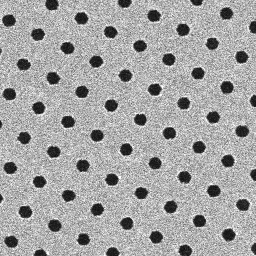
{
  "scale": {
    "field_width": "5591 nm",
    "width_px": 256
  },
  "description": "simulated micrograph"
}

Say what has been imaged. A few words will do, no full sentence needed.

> a regular array of holes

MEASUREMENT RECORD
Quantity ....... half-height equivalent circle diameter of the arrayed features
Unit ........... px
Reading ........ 13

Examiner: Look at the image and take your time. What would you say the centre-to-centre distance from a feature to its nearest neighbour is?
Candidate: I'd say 704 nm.